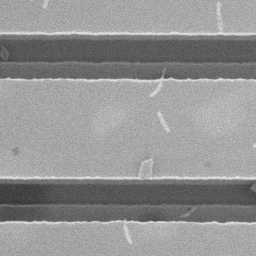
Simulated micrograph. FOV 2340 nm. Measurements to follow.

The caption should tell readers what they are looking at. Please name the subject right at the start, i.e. lines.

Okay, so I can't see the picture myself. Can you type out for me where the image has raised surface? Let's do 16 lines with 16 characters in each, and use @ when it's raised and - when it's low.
@@@@@@@@@@@@@@@@
@@@@@@@@@@@@@@@@
----------------
----------------
----------------
@@@@@@@@@@@@@@@@
@@@@@@@@@@@@@@@@
@@@@@@@@@@@@@@@@
@@@@@@@@@@@@@@@@
@@@@@@@@@@@@@@@@
@@@@@@@@@@@@@@@@
----------------
----------------
----------------
@@@@@@@@@@@@@@@@
@@@@@@@@@@@@@@@@